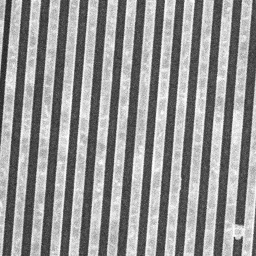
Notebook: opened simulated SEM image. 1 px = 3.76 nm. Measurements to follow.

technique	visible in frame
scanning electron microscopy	parallel lines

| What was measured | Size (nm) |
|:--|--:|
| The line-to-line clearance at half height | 36.6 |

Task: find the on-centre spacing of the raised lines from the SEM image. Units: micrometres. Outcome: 0.0719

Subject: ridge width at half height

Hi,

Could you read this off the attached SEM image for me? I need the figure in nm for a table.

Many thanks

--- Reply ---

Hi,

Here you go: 36.6